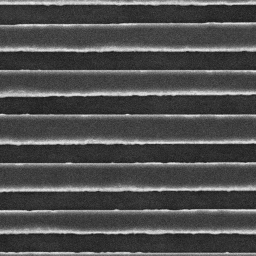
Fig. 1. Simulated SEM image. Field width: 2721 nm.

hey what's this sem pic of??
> lines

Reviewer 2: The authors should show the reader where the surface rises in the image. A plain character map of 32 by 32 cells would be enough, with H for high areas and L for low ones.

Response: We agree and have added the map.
HHHHHHHHHHHHHHHHHHHHHHHHHHHHHHHH
LLLLLLLLLLLLLLLLLLLLLLLLLLLLLLLL
LLLLLLLLLLLLLLLLLLLLLLLLLLLLLLLL
HHHHHHHHHHHHHHHHHHHHHHHHHHHHHHHH
HHHHHHHHHHHHHHHHHHHHHHHHHHHHHHHH
HHHHHHHHHHHHHHHHHHHHHHHHHHHHHHHH
LLLLLLLLLLLLLLLLLLLLLLLLLLLLLLLL
LLLLLLLLLLLLLLLLLLLLLLLLLLLLLLLL
LLLLLLLLLLLLLLLLLLLLLLLLLLLLLLLL
HHHHHHHHHHHHHHHHHHHHHHHHHHHHHHHH
HHHHHHHHHHHHHHHHHHHHHHHHHHHHHHHH
HHHHHHHHHHHHHHHHHHHHHHHHHHHHHHHH
LLLLLLLLLLLLLLLLLLLLLLLLLLLLLLLL
LLLLLLLLLLLLLLLLLLLLLLLLLLLLLLLL
HHHHHHHHHHHHHHHHHHHHHHHHHHHHHHHH
HHHHHHHHHHHHHHHHHHHHHHHHHHHHHHHH
HHHHHHHHHHHHHHHHHHHHHHHHHHHHHHHH
HHHHHHHHHHHHHHHHHHHHHHHHHHHHHHHH
LLLLLLLLLLLLLLLLLLLLLLLLLLLLLLLL
LLLLLLLLLLLLLLLLLLLLLLLLLLLLLLLL
HHHHHHHHHHHHHHHHHHHHHHHHHHHHHHHH
HHHHHHHHHHHHHHHHHHHHHHHHHHHHHHHH
HHHHHHHHHHHHHHHHHHHHHHHHHHHHHHHH
HHHHHHHHHHHHHHHHHHHHHHHHHHHHHHHH
LLLLLLLLLLLLLLLLLLLLLLLLLLLLLLLL
LLLLLLLLLLLLLLLLLLLLLLLLLLLLLLLL
HHHHHHHHHHHHHHHHHHHHHHHHHHHHHHHH
HHHHHHHHHHHHHHHHHHHHHHHHHHHHHHHH
HHHHHHHHHHHHHHHHHHHHHHHHHHHHHHHH
LLLLLLLLLLLLLLLLLLLLLLLLLLLLLLLL
LLLLLLLLLLLLLLLLLLLLLLLLLLLLLLLL
LLLLLLLLLLLLLLLLLLLLLLLLLLLLLLLL